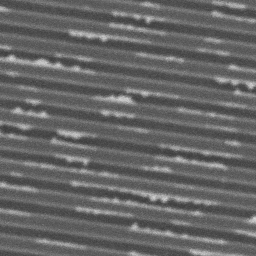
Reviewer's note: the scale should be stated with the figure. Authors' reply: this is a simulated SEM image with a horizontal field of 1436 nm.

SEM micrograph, parallel lines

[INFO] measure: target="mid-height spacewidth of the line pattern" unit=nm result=60.4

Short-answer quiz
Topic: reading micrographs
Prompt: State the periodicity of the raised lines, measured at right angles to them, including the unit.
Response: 139 nm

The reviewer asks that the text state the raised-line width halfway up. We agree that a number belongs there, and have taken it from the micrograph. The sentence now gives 82.5 nm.